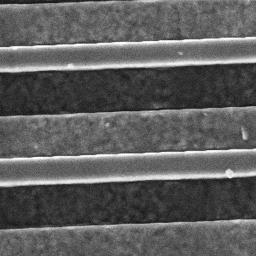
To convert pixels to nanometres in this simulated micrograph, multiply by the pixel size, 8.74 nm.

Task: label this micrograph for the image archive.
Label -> lines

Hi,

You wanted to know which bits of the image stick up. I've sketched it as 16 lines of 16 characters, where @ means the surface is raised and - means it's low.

@@@@@@@@@@@@@@@@
@@@@@@@@@@@@@@@@
@@@@@@@@@@@@@@@@
@@@@@@@@@@@@@@@@
----------------
----------------
----------------
@@@@@@@@@@@@@@@@
@@@@@@@@@@@@@@@@
@@@@@@@@@@@@@@@@
@@@@@@@@@@@@@@@@
@@--------------
----------------
----------------
@@@@@@@@@@@@@@@@
@@@@@@@@@@@@@@@@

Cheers